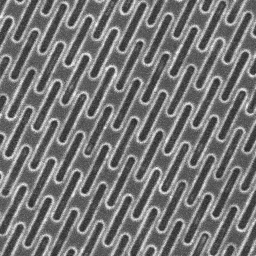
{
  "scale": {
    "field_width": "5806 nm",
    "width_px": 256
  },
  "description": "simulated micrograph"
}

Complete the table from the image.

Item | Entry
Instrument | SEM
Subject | a regular array of holes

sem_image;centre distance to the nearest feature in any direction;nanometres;643